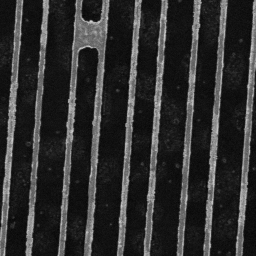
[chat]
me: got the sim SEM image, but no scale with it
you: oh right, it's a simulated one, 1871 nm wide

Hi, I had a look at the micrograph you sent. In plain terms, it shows parallel lines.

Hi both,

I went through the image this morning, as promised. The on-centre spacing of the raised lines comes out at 216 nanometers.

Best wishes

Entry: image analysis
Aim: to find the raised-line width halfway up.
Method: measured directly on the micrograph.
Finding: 41.9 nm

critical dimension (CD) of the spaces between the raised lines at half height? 160 nm